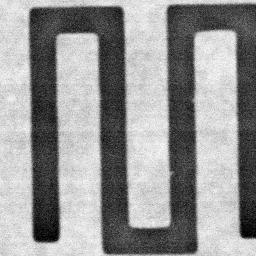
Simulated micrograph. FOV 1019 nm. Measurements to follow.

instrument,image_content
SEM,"groups of lines, slits or small figures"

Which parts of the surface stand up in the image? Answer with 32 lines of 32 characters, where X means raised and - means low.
XXXXXXXXXXXXXXXXXXXXXXXX--------
XXXX-----------XXXXXX-----------
XXX-------------XXXXX-----------
XXX-------------XXXXX-----------
XXXX---XXXXX----XXXXX---XXXXX---
XXXX---XXXXX----XXXXX---XXXXX---
XXXX---XXXXX----XXXXX---XXXXX---
XXXX---XXXXX----XXXXX---XXXXX---
XXXX---XXXXX----XXXXX---XXXXX---
XXXX---XXXXX----XXXXX---XXXXXX--
XXXX---XXXXX----XXXXX---XXXXXX--
XXXX---XXXXX----XXXXX---XXXXXX--
XXXX---XXXXX----XXXXX---XXXXXX--
XXXX---XXXXX----XXXXX---XXXXXX--
XXXX---XXXXX----XXXXX---XXXXXX--
XXXX---XXXXX----XXXXX---XXXXXX--
XXXX---XXXXX----XXXXX----XXXXX--
XXXX---XXXXX----XXXXX----XXXXX--
XXXX---XXXXX----XXXXX----XXXXX--
XXXX---XXXXX----XXXXX----XXXXX--
XXXX---XXXXXX---XXXXX----XXXXX--
XXXX---XXXXXX---XXXXX----XXXXX--
XXXX---XXXXXX---XXXXX----XXXXX--
XXXX---XXXXXX---XXXXX----XXXXX--
XXXX---XXXXXX---XXXXX----XXXXX--
XXXX---XXXXXX---XXXXX----XXXXX--
XXXX----XXXXX---XXXXX----XXXXX--
XXXX----XXXXX---XXXXX----XXXXX--
XXXX----XXXXX------------XXXXX--
XXXX---XXXXXX------------XXXXX--
XXXXXXXXXXXXX------------XXXXXXX
XXXXXXXXXXXXX-----------XXXXXXXX